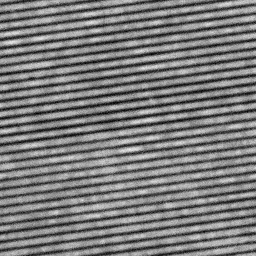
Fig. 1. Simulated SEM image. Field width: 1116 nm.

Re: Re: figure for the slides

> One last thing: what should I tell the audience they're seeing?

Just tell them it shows parallel lines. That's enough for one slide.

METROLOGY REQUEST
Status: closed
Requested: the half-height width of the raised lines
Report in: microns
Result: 0.027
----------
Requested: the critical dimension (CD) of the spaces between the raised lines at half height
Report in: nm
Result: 11.3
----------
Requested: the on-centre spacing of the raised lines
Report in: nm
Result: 38